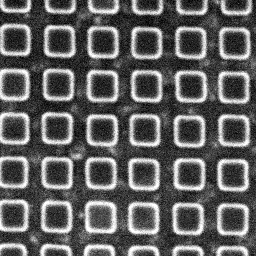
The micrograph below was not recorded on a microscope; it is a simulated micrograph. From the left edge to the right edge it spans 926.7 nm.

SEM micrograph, a regular array of raised bodies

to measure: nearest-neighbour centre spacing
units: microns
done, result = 0.157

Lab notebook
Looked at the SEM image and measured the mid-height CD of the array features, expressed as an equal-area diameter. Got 119 nm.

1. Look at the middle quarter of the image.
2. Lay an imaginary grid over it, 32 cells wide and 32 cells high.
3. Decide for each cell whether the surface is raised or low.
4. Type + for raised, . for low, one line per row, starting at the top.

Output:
................................
................................
++....+++++++....+++++++....++++
++....+++++++....+++++++....++++
++....+++++++....+++++++....++++
++....+++++++....+++++++....++++
++....+++++++....+++++++....++++
++....+++++++....+++++++....++++
++....+++++++....+++++++....++++
................................
................................
................................
................................
++....+++++++....++++++.....++++
++....+++++++....+++++++....++++
++....+++++++....+++++++....++++
++....+++++++....+++++++....++++
++....+++++++....+++++++....++++
++....+++++++....+++++++....++++
+.....+++++++....+++++++....++++
...............................+
................................
................................
................................
++....+++++++....++++++.....++++
++....+++++++...+++++++.....++++
++....+++++++...++++++++....++++
++....+++++++...++++++++....++++
++....+++++++....+++++++....++++
++....+++++++...++++++++....++++
++....++++++.....+++++++....++++
................................